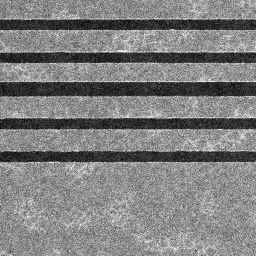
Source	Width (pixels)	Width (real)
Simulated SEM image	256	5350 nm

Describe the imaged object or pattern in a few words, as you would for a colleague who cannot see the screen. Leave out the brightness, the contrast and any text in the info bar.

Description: parallel lines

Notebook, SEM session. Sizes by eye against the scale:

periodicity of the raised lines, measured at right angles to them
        687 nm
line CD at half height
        444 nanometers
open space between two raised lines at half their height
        243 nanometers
